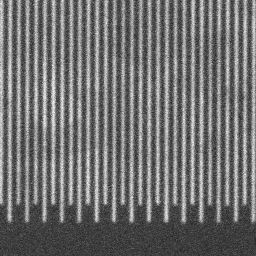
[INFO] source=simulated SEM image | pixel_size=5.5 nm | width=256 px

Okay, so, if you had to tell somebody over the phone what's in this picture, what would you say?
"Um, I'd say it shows parallel lines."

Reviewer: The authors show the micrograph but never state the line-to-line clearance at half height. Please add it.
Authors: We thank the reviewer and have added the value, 39.2 nm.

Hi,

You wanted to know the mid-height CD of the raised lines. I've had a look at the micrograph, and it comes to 0.0089 micrometres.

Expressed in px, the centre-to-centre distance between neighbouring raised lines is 8.71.